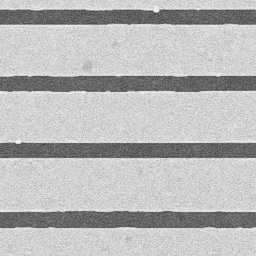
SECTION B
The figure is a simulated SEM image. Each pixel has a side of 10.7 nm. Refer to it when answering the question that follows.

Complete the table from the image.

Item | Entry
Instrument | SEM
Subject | lines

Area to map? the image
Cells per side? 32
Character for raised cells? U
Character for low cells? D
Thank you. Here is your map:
UUUUUUUUUUUUUUUUUUUUUUUUUUUUUUUU
DDDDDDDDDDDDDDDDDDDDDDDDDDDDDDDD
DDDDDDDDDDDDDDDDDDDDDDDDDDDDDDDD
UUUUUUUUUUUUUUUUUUUUUUUUUUUUUUUU
UUUUUUUUUUUUUUUUUUUUUUUUUUUUUUUU
UUUUUUUUUUUUUUUUUUUUUUUUUUUUUUUU
UUUUUUUUUUUUUUUUUUUUUUUUUUUUUUUU
UUUUUUUUUUUUUUUUUUUUUUUUUUUUUUUU
UUUUUUUUUUUUUUUUUUUUUUUUUUUUUUUU
UUDDDDDDUDDDDDDDDDDDDUUDDDDUDDDD
DDDDDDDDDDDDDDDDDDDDDDDDDDDDDDDD
UDDDUUDDDUUDDDDDDUUUUUDDDUUUUUUU
UUUUUUUUUUUUUUUUUUUUUUUUUUUUUUUU
UUUUUUUUUUUUUUUUUUUUUUUUUUUUUUUU
UUUUUUUUUUUUUUUUUUUUUUUUUUUUUUUU
UUUUUUUUUUUUUUUUUUUUUUUUUUUUUUUU
UUUUUUUUUUUUUUUUUUUUUUUUUUUUUUUU
UUUUUUUUUUUUUUUUUUUUUUUUUUUUUUUU
DDDDDDDDDDDDDDDDDDDDDDDDDDDDDDDD
DDDDDDDDDDDDDDDDDDDDDDDDDDDDDDDD
UUUUUUUUUUUUUUUUUUUUUUUUUUUUUUUU
UUUUUUUUUUUUUUUUUUUUUUUUUUUUUUUU
UUUUUUUUUUUUUUUUUUUUUUUUUUUUUUUU
UUUUUUUUUUUUUUUUUUUUUUUUUUUUUUUU
UUUUUUUUUUUUUUUUUUUUUUUUUUUUUUUU
UUUUUUUUUUUUUUUUUUUUUUUUUUUUUUUU
DDDDDDDDDDDDDDDDDDDDDDDDDDDDDDDD
DDDDDDDDDDDDDDDDDDDDDDDDDDDDDDDD
DDDUDDUDDDDDDDDUUDDDDDDDDDDDDDDD
UUUUUUUUUUUUUUUUUUUUUUUUUUUUUUUU
UUUUUUUUUUUUUUUUUUUUUUUUUUUUUUUU
UUUUUUUUUUUUUUUUUUUUUUUUUUUUUUUU